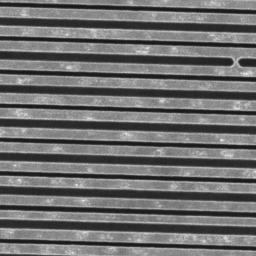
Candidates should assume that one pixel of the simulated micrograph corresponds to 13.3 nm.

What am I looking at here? parallel lines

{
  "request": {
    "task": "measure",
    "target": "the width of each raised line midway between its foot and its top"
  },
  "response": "148 nanometres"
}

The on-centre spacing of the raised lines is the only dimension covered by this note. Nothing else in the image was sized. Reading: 226 nanometers